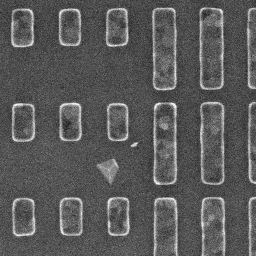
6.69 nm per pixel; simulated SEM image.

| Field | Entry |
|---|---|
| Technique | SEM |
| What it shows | wiring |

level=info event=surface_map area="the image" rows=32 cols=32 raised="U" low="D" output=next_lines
DDDDDDDDDDDDDDDDDDDDDDDDDDDDDDDD
DDUUDDDDUUDDDDUUDDDUUUDDDUUUDDDU
DUUUDDDUUUDDDUUUDDDUUUDDDUUUDDDU
DUUUDDDUUUDDDUUUDDDUUUDDDUUUDDDU
DUUUDDDUUUDDDUUUDDDUUUDDDUUUDDDU
DDUUDDDDUUDDDUUUDDDUUUDDDUUUDDDU
DDDDDDDDDDDDDDDDDDDUUUDDDUUUDDDU
DDDDDDDDDDDDDDDDDDDUUUDDDUUUDDDU
DDDDDDDDDDDDDDDDDDDUUUDDDUUUDDDU
DDDDDDDDDDDDDDDDDDDUUUDDDUUUDDDU
DDDDDDDDDDDDDDDDDDDUUUDDDUUUDDDU
DDDDDDDDDDDDDDDDDDDDDDDDDDDDDDDD
DDDDDDDDDDDDDDDDDDDDDDDDDDDDDDDD
DDUUDDDDUUDDDDUUDDDUUUDDDUUUDDDU
DDUUDDDDUUDDDUUUDDDUUUDDDUUUDDDU
DDUUDDDDUUDDDDUUDDDUUUDDDUUUDDDU
DDUUDDDDUUDDDDUUDDDUUUDDDUUUDDDU
DDUUDDDDUUDDDDUDDDDUUUDDDUUUDDDU
DDDDDDDDDDDDDDDDDDDUUUDDDUUUDDDU
DDDDDDDDDDDDDDDDDDDUUUDDDUUUDDDU
DDDDDDDDDDDDDUUDDDDUUUDDDUUUDDDU
DDDDDDDDDDDDDUDDDDDUUUDDDUUUDDDU
DDDDDDDDDDDDDDDDDDDUUUDDDUUUDDDU
DDDDDDDDDDDDDDDDDDDDDDDDDDDDDDDD
DDDDDDDDDDDDDDDDDDDDDDDDDDDDDDDD
DDUUDDDDUUDDDDUUDDDUUUDDDUUUDDDU
DDUUDDDDUUDDDDUUDDDUUUDDDUUUDDDU
DDUUDDDDUUDDDDUUDDDUUUDDDUUUDDDU
DDUUDDDDUUDDDDUUDDDUUUDDDUUUDDDU
DDUDDDDDDDDDDDDDDDDUUUDDDUUUDDDU
DDDDDDDDDDDDDDDDDDDUUUDDDUUUDDDU
DDDDDDDDDDDDDDDDDDDUUUDDDUUUDDDU